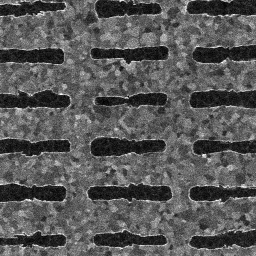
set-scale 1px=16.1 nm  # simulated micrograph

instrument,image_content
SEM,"holes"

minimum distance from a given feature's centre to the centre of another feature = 0.75 microns